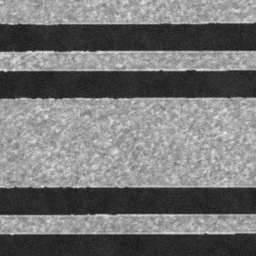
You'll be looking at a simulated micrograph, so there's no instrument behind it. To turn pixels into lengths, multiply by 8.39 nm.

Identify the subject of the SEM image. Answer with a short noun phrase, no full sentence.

lines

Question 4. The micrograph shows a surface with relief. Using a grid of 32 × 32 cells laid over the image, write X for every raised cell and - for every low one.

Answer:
XXXXXXXXXXXXXXXXXXXXXXXXXXXXXXXX
XXXXXXXXXXXXXXXXXXXXXXXXXXXXXXXX
XXXXXXXXXXXXXXXXXXXXXXXXXXXXXXXX
--------------------------------
--------------------------------
--------------------------------
---------X--XXXXXXXXXXXXXXXXXXXX
XXXXXXXXXXXXXXXXXXXXXXXXXXXXXXXX
XXXXXXXXXXXXXXXXXXXXXXXXXXXXXXXX
--------------------------------
--------------------------------
--------------------------------
XXXXXXXXXXXXXXXXXXXXXXXXXXXXXXXX
XXXXXXXXXXXXXXXXXXXXXXXXXXXXXXXX
XXXXXXXXXXXXXXXXXXXXXXXXXXXXXXXX
XXXXXXXXXXXXXXXXXXXXXXXXXXXXXXXX
XXXXXXXXXXXXXXXXXXXXXXXXXXXXXXXX
XXXXXXXXXXXXXXXXXXXXXXXXXXXXXXXX
XXXXXXXXXXXXXXXXXXXXXXXXXXXXXXXX
XXXXXXXXXXXXXXXXXXXXXXXXXXXXXXXX
XXXXXXXXXXXXXXXXXXXXXXXXXXXXXXXX
XXXXXXXXXXXXXXXXXXXXXXXXXXXXXXXX
XXXXXXXXXXXXXXXXXXXXXXXXXXXXXXXX
--------------------------------
--------------------------------
--------------------------------
--------------------------------
XXXXXXXXXXXXXXXXXXXXXXXXXXXXXXXX
XXXXXXXXXXXXXXXXXXXXXXXXXXXXXXXX
--------------------------------
--------------------------------
--------------------------------